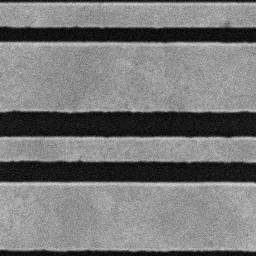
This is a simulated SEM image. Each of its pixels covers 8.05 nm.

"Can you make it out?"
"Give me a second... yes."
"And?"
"lines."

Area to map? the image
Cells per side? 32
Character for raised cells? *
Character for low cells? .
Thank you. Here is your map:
***********.****..***********.**
********************************
********************************
................................
................................
****************************.**.
********************************
********************************
********************************
********************************
********************************
********************************
********************************
********************************
................................
................................
................................
********************************
********************************
********************************
................................
................................
................................
********************************
********************************
********************************
********************************
********************************
********************************
********************************
********************************
................................